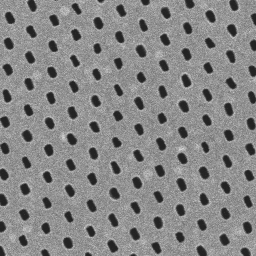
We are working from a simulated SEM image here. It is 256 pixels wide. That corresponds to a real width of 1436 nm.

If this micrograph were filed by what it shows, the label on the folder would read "a regular array of holes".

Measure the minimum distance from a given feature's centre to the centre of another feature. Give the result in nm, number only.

142